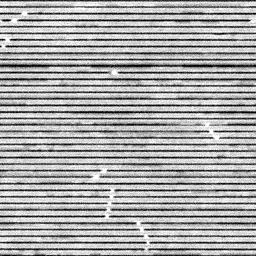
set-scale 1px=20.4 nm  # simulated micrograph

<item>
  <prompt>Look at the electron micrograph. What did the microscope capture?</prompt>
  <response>parallel lines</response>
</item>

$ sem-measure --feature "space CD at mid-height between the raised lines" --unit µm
0.0383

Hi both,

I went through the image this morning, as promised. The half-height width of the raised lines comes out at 99.6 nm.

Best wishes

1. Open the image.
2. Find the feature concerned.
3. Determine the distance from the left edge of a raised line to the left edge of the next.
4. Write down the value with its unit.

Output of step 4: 134 nm